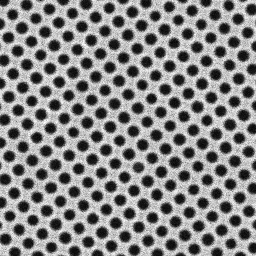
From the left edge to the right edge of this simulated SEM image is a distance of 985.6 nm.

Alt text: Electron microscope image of a regular array of holes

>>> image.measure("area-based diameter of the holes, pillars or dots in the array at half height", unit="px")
11.6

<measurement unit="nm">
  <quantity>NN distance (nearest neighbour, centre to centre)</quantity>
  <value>62.9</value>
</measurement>